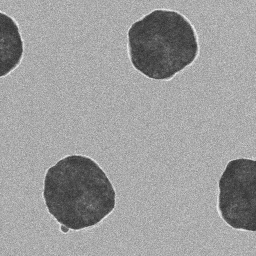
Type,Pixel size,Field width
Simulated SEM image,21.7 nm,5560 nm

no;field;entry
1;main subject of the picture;holes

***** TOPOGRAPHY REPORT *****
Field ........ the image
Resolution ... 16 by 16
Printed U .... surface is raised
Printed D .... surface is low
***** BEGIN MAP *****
UUUUUUUUUUUUUUUU
DUUUUUUUDDDDUUUU
DUUUUUUUDDDDUUUU
DUUUUUUUDDDDUUUU
DUUUUUUUUDDUUUUU
UUUUUUUUUUUUUUUU
UUUUUUUUUUUUUUUU
UUUUUUUUUUUUUUUU
UUUUUUUUUUUUUUUU
UUUUUUUUUUUUUUUU
UUUDDDUUUUUUUUDD
UUUDDDDUUUUUUUDD
UUUDDDDUUUUUUUDD
UUUDDDDUUUUUUUDD
UUUUUUUUUUUUUUUU
UUUUUUUUUUUUUUUU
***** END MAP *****